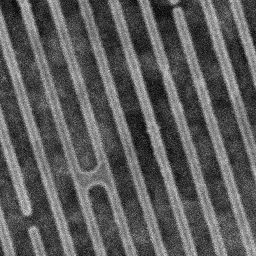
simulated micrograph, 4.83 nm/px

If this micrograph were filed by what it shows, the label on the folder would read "parallel lines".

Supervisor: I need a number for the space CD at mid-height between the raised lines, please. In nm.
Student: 105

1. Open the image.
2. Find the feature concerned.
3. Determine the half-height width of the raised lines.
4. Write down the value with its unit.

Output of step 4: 33.4 nanometres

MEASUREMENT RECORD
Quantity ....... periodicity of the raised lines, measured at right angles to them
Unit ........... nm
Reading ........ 140